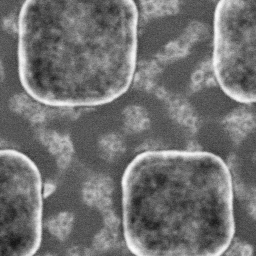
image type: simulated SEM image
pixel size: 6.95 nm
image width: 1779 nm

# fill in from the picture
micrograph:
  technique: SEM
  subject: raised bodies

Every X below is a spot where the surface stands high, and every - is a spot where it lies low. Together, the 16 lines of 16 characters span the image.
-XXXXXXX------XX
-XXXXXXX-----XXX
-XXXXXXX------XX
-XXXXXXX-----XXX
-XXXXXXX-----XXX
--XXXXXX------XX
---XXX----------
----------------
----------------
X---------------
XX------XXXXXX--
XX------XXXXXX--
XXX-----XXXXXX--
XXX-----XXXXXXX-
XX------XXXXXX--
XX------XXXXXX--